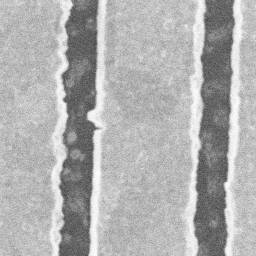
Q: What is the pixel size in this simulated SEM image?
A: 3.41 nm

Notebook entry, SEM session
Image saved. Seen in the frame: one or a few lines or trenches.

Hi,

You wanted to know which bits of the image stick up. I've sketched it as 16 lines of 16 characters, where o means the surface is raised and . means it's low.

oooo..ooooooo..o
oooo..ooooooo..o
oooo..ooooooo..o
oooo..oooooo...o
oooo..oooooo...o
oooo..oooooo...o
oooo..oooooo...o
oooo..oooooo...o
oooo..oooooo...o
oooo..oooooo...o
oooo..oooooo..oo
oooo..oooooo..oo
oooo..oooooo..oo
oooo..oooooo..oo
ooo...oooooo..oo
oooo..oooooo..oo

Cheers